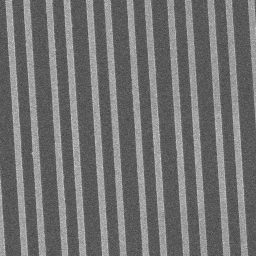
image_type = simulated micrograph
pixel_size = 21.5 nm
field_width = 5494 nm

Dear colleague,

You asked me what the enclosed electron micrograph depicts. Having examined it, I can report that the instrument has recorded parallel lines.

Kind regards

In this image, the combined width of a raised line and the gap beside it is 428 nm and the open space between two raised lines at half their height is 0.257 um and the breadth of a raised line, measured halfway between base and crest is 131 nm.